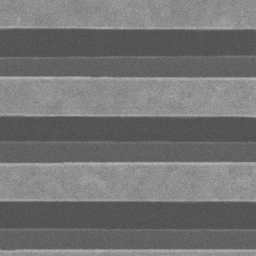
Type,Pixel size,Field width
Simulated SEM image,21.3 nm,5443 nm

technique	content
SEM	lines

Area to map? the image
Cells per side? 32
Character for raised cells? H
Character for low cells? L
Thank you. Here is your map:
HHHHHHHHHHHHHHHHHHHHHHHHHHHHHHHH
HHHHHHHHHHHHHHHHHHHHHHHHHHHHHHHH
HHHHHHHHHHHHHHHHHHHHHHHHHHHHHHHH
LLLLLLLLLHHHHHHHHHHHHHHHHHHHHHHH
LLLLLLLLLLLLLLLLLLLLLLLLLLLLLLLL
LLLLLLLLLLLLLLLLLLLLLLLLLLLLLLLL
LLLLLLLLLLLLLLLLLLLLLLLLLLLLLLLL
HHHHHHHHHHHHHHHHHHHHHHHHHHHHHHHH
HHHHHHHHHHHHHHHHHHHHHHHHHHHHHHHH
HHHHHHHHHHHHHHHHHHHHHHHHHHHHHHHH
HHHHHHHHHHHHHHHHHHHHHHHHHHHHHHHH
HHHHHHHHHHHHHHHHHHHHHHHHHHHHHHHH
HHHHHHHHHHHHHHHHHHHHHHHHHHHHHHHH
HHHHHHHHHHHHHHHHHHHHHHHHHHHHHHHH
LLLLLLLLLLLLLLLLLLLLLLLLLLHHLLHH
LLLLLLLLLLLLLLLLLLLLLLLLLLLLLLLL
LLLLLLLLLLLLLLLLLLLLLLLLLLLLLLLL
LLLLLLLLLLLLLLLLLLLLLLLLLLLLLLLL
HHHHHHHHHHHHHHHHHHHHHHHHHHHHHHHH
HHHHHHHHHHHHHHHHHHHHHHHHHHHHHHHH
HHHHHHHHHHHHHHHHHHHHHHHHHHHHHHHH
HHHHHHHHHHHHHHHHHHHHHHHHHHHHHHHH
HHHHHHHHHHHHHHHHHHHHHHHHHHHHHHHH
HHHHHHHHHHHHHHHHHHHHHHHHHHHHHHHH
HHHHHHHHHHHHHHHHHHHHHHHHHHHHHHHH
LLLLLLLLLLLLLLLLLLLLLLLLLLLLLLLL
LLLLLLLLLLLLLLLLLLLLLLLLLLLLLLLL
LLLLLLLLLLLLLLLLLLLLLLLLLLLLLLLL
LLLLLLLLLLLLLLLLLLLLLLLLLLLLLLLL
HHHHHHHHHHHHHHHHHHHHHHHHHHHHHHHH
HHHHHHHHHHHHHHHHHHHHHHHHHHHHHHHH
HHHHHHHHHHHHHHHHHHHHHHHHHHHHHHHH